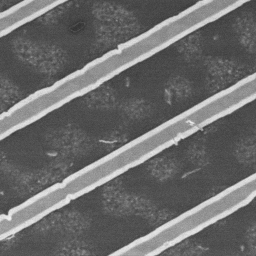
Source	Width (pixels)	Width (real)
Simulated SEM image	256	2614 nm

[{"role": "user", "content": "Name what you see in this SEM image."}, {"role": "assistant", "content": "one or a few lines or trenches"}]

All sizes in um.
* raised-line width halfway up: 0.19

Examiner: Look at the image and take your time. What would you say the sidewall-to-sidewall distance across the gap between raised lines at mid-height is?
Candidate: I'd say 711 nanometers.